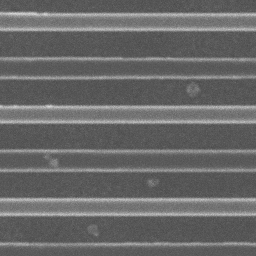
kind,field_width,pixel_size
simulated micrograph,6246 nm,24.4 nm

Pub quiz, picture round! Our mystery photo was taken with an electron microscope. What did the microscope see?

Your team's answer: lines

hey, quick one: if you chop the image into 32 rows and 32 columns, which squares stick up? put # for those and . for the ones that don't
................................
................................
################################
################################
................................
................................
................................
################################
################################
################################
................................
................................
................................
################################
################################
................................
................................
................................
................................
################################
################################
................................
................................
................................
................................
################################
################################
................................
................................
................................
................................
################################